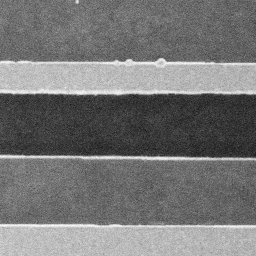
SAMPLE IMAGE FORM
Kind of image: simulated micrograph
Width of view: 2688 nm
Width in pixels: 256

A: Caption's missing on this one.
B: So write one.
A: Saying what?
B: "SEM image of lines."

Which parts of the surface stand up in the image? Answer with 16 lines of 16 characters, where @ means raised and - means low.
@@@@@@@@@@@@@@@@
@@@@@@@@@@@@@@@@
@@@@@@@@@@@@@@@@
@@@@@@@@@@@@@@@@
@@@@@@@@@@@@@@@@
@@@@@@@@@@@@@@@@
----------------
----------------
----------------
----------------
@@@@@@@@@@@@@@@@
@@@@@@@@@@@@@@@@
@@@@@@@@@@@@@@@@
@@@@@@@@@@@@@@@@
@@@@@@@@@@@@@@@@
@@@@@@@@@@@@@@@@